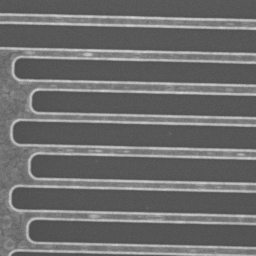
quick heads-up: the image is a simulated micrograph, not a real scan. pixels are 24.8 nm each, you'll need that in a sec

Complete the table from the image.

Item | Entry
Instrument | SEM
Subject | parallel lines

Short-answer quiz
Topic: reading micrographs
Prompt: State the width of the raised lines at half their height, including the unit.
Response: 208 nm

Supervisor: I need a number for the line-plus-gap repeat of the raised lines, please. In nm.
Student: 807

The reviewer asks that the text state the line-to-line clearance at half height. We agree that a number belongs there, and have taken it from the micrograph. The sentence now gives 599 nm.